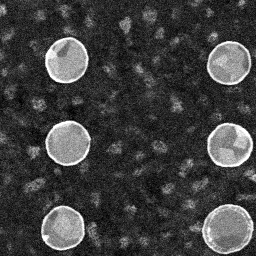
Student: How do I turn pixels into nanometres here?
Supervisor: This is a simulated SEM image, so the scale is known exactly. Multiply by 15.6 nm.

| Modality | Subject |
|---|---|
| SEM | raised bodies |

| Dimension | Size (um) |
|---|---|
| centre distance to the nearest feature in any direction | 1.29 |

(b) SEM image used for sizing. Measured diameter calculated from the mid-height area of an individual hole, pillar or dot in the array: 0.668 um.